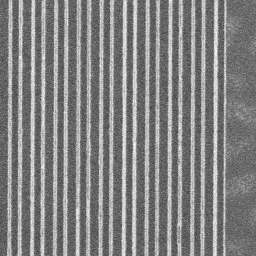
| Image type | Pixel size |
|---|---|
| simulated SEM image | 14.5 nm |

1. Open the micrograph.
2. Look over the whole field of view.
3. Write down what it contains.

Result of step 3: parallel lines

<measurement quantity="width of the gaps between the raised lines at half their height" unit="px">8.5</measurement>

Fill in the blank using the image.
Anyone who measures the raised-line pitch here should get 166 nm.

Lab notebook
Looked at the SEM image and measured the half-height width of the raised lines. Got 0.0272 micrometres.